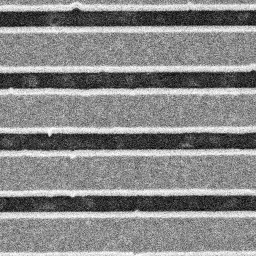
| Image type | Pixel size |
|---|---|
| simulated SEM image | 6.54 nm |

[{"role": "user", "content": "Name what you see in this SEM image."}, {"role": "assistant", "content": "one or a few lines or trenches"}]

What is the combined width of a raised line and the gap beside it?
404 nanometers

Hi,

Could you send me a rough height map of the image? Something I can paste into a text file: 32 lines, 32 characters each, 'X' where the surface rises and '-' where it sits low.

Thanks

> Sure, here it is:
XXXXXXXXXXXXXXXXXXXXXXXXXXXXXXXX
--------------------------------
--------------------------------
--------------------------------
XXXXXXXXXXXXXXXXXXXXXXXXXXXXXXXX
XXXXXXXXXXXXXXXXXXXXXXXXXXXXXXXX
XXXXXXXXXXXXXXXXXXXXXXXXXXXXXXXX
XXXXXXXXXXXXXXXXXXXXXXXXXXXXXXXX
XXXXXXXXXXXXXXXXXXXXXXXXXXXXXXXX
--------------------------------
--------------------------------
XXXXXXXXXX--XXXXXXXXXXXXXXXXXXXX
XXXXXXXXXXXXXXXXXXXXXXXXXXXXXXXX
XXXXXXXXXXXXXXXXXXXXXXXXXXXXXXXX
XXXXXXXXXXXXXXXXXXXXXXXXXXXXXXXX
XXXXXXXXXXXXXXXXXXXXXXXXXXXXXXXX
--------------------------------
--------------------------------
--------------------------------
XXXXXXXXXXXXXXXXXXXXXXXXXXXXXXXX
XXXXXXXXXXXXXXXXXXXXXXXXXXXXXXXX
XXXXXXXXXXXXXXXXXXXXXXXXXXXXXXXX
XXXXXXXXXXXXXXXXXXXXXXXXXXXXXXXX
XXXXXXXXXXXXXXXXXXXXXXXXXXXXXXXX
--------------------------------
--------------------------------
--------------------------------
XXXXXXXXXXXXXXXXXXXXXXXXXXXXXXXX
XXXXXXXXXXXXXXXXXXXXXXXXXXXXXXXX
XXXXXXXXXXXXXXXXXXXXXXXXXXXXXXXX
XXXXXXXXXXXXXXXXXXXXXXXXXXXXXXXX
XXXXXXXXXXXXXXXXXXXXXXXXXXXXXXXX